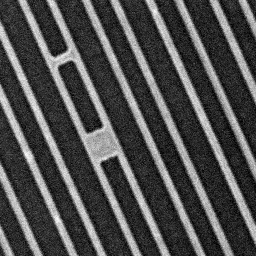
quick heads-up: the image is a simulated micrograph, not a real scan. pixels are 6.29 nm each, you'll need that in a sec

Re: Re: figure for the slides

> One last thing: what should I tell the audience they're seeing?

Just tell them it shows parallel lines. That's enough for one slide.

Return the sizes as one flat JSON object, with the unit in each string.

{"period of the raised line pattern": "0.183 microns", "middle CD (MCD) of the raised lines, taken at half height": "33.6 nm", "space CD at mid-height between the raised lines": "0.168 micrometres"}